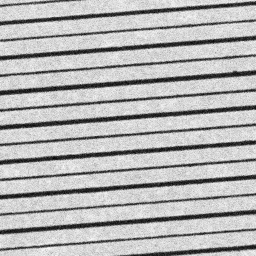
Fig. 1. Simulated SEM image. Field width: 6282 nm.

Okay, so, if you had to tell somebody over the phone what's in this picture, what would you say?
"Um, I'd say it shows parallel lines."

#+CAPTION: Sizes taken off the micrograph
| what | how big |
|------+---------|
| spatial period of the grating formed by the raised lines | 425 nm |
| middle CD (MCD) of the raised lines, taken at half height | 315 nanometres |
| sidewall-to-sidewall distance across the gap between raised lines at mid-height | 119 nm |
